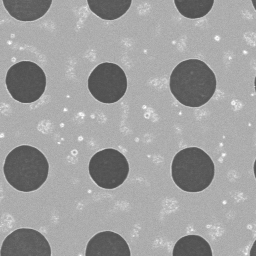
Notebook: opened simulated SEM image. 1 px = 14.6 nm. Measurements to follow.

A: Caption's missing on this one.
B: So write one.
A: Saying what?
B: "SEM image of holes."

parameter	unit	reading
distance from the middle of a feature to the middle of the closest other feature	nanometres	1210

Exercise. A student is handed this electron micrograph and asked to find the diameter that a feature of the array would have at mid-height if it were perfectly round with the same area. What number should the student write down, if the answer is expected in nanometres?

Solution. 622